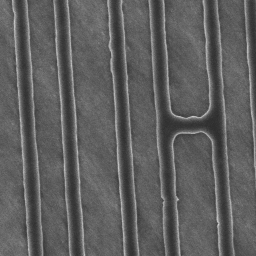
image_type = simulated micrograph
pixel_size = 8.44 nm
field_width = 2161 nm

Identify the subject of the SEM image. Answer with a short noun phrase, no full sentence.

parallel lines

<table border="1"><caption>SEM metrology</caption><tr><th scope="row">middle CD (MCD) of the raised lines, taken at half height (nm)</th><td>124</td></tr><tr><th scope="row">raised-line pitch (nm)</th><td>401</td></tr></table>